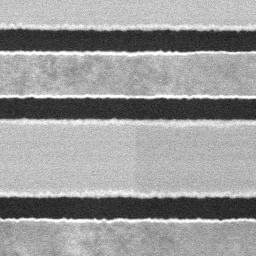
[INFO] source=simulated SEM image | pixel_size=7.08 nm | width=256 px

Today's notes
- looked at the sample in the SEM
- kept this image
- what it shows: lines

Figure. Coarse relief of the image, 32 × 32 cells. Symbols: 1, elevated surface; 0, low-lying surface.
11111111111111111111111111111111
11111111111111111111111111111111
11111111111111111111111111111111
11111111111111111111111111111111
00000000000000000000000000000000
00000000000000000000000000000000
00101000000000000000100001000000
11111111111111111111111111111111
11111111111111111111111111111111
11111111111111111111111111111111
11111111111111111111111111111111
11111111111111111111111111111111
00000000000000000000000000000000
00000000000000000000000000000000
00000000000000000000000000000000
11111111111111111111111111111111
11111111111111111111111111111111
11111111111111111111111111111111
11111111111111111111111111111111
11111111111111111111111111111111
11111111111111111111111111111111
11111111111111111111111111111111
11111111111111111111111111111111
11111111111111111111111111111111
11111111111111111111111111111111
00000000000000000000000000000000
00000000000000000000000000000000
11111111110100110111110111000111
11111111111111111111111111111111
11111111111111111111111111111111
11111111111111111111111111111111
11111111111111111111111111111111